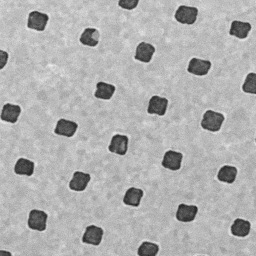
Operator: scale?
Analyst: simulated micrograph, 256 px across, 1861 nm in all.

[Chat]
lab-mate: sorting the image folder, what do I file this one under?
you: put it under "a regular array of holes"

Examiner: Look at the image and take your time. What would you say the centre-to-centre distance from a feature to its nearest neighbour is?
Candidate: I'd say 0.395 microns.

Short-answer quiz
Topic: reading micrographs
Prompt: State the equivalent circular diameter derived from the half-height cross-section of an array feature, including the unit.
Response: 0.153 micrometres